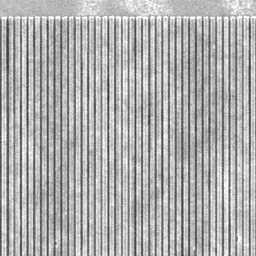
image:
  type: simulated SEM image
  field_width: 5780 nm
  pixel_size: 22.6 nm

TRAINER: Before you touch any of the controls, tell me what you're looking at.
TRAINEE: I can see parallel lines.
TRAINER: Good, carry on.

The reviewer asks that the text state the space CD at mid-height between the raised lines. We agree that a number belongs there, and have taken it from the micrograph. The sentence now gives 64.9 nm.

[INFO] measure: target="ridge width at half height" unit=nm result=87.5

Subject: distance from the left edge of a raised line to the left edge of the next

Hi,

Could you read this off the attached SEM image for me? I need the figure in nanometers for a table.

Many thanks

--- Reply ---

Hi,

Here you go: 152